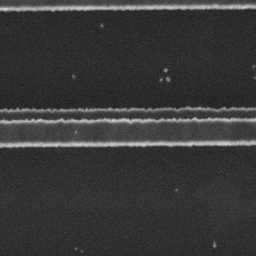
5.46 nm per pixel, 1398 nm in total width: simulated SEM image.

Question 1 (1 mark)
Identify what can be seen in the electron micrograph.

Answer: lines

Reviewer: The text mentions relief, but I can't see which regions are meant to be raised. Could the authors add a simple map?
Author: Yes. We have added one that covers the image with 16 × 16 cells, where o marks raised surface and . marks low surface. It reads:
oooooooooooooooo
................
................
................
................
................
................
oooooooooooooooo
oooooooooooooooo
................
................
................
................
................
................
................